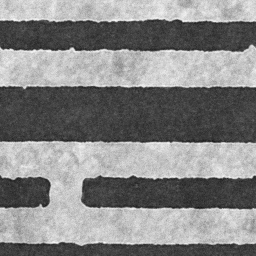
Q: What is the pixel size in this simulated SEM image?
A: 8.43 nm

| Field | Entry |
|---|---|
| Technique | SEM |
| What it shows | one or a few lines or trenches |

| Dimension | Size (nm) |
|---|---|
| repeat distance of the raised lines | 663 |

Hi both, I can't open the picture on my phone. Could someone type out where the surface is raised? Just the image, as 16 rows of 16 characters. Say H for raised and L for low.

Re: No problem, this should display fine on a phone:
HHHHHHHHHHHHHHHH
LLLLLLLLLLLLLLLL
LLLLLLLLLLLLLLLL
HHHHHHHHHHHHHHHH
HHHHHHHHHHHHHHHH
LLLLLLLLLLLLLLLL
LLLLLLLLLLLLLLLL
LLLLLLLLLLLLLLLL
LLLLLLLLLLLLLLLL
HHHHHHHHHHHHHHHH
HHHHHHHHHHHHHHHH
LLLHHLLLLLLLLLLL
LLLHHLLLLLLLLLLL
HHHHHHHHHHHHHHHH
HHHHHHHHHHHHHHHH
LLLLLLLLLLLLLLLL